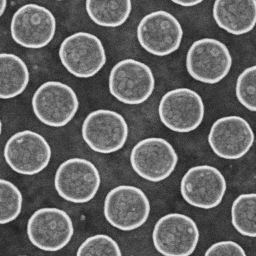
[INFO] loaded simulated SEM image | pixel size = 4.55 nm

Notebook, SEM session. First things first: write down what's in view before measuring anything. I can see a regular array of raised bodies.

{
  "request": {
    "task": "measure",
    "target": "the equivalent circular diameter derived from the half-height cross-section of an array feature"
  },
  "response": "42.1 px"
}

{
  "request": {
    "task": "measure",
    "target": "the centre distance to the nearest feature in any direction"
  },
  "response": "0.255 micrometres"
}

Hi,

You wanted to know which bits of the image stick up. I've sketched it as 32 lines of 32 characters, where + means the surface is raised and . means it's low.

+..........+++++.......+...+++++
..++++.....+++++...........+++++
..+++++.....+++...++++.....+++++
..+++++..........+++++......+++.
..++++...++......++++++.........
...+++..+++++.....++++..+++.....
........+++++......++...++++....
++......+++++...........+++++...
+++.....++++..++++......++++....
+++...........+++++.....++++..++
+++...+.......+++++...........++
++...++++.....+++++..+++......++
....+++++......+++..+++++.....++
....+++++...........+++++......+
.....++++..++++.....+++++.......
......++...+++++.....++++..++++.
...........+++++..........+++++.
.++++......++++....+......++++++
.+++++......+++..++++......++++.
.+++++...........+++++......++..
.+++++..+++......+++++..........
...+...+++++.....++++...+++.....
.......+++++...........+++++....
++.....+++++...++......+++++....
++......+++...++++.....+++++...+
++...........+++++......+++..+++
++...+++.....+++++...........+++
+...+++++.....++++..++++.....+++
....+++++......+....++++......++
....+++++..........++++++.......
....++++...+++.....+++++...++...
..........+++++.....++++..++++..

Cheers